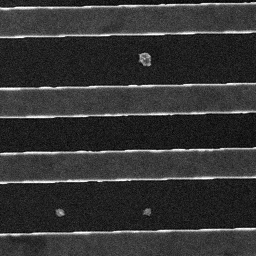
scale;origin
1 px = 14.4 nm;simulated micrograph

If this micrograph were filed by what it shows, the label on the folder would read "lines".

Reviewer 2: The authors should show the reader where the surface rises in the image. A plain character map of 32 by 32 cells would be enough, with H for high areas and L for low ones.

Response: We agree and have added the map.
LLLLLLLLLLLLLLLLLLLLLLLLLHHHHHHH
HHHHHHHHHHHHHHHHHHHHHHHHHHHHHHHH
HHHHHHHHHHHHHHHHHHHHHHHHHHHHHHHH
HHHHHHHHHHHHHHHHHHHHHHHHHHHHHHHH
HHHHHHHHLLLLLLLLLLLLLLLLLLLLLLLL
LLLLLLLLLLLLLLLLLLLLLLLLLLLLLLLL
LLLLLLLLLLLLLLLLLLLLLLLLLLLLLLLL
LLLLLLLLLLLLLLLLLLLLLLLLLLLLLLLL
LLLLLLLLLLLLLLLLLLLLLLLLLLLLLLLL
LLLLLLLLLLLLLLLLLLLLLLLLLLLLLLLL
LLLLLLLLLLLLLLLLLLLLLLLLLLLLHHHH
HHHHHHHHHHHHHHHHHHHHHHHHHHHHHHHH
HHHHHHHHHHHHHHHHHHHHHHHHHHHHHHHH
HHHHHHHHHHHHHHHHHHHHHHHHHHHHHHHH
HHHHHHHHHHHLLLLLLLLLLLLLLLLLLLLL
LLLLLLLLLLLLLLLLLLLLLLLLLLLLLLLL
LLLLLLLLLLLLLLLLLLLLLLLLLLLLLLLL
LLLLLLLLLLLLLLLLLLLLLLLLLLLLLLLL
LLLLLLLLLLLLLLLLLLLLLLLLLLLLLLLH
HHHHHHHHHHHHHHHHHHHHHHHHHHHHHHHH
HHHHHHHHHHHHHHHHHHHHHHHHHHHHHHHH
HHHHHHHHHHHHHHHHHHHHHHHHHHHHHHHH
HHHHHHHHHHHHHHHHLLLLLLLLLLLLLLLL
LLLLLLLLLLLLLLLLLLLLLLLLLLLLLLLL
LLLLLLLLLLLLLLLLLLLLLLLLLLLLLLLL
LLLLLLLLLLLLLLLLLLLLLLLLLLLLLLLL
LLLLLLLLLLLLLLLLLLLLLLLLLLLLLLLL
LLLLLLLLLLLLLLLLLLLLLLLLLLLLLLLL
LLLLLLLLLLLLLLLLLLLLLLLLLLLLLLLL
HHHHHHHHHHHHHHHHHHHHHHHHHHHHHHHH
HHHHHHHHHHHHHHHHHHHHHHHHHHHHHHHH
HHHHHHHHHHHHHHHHHHHHHHHHHHHHHHHH